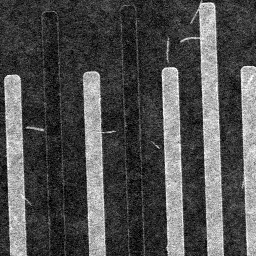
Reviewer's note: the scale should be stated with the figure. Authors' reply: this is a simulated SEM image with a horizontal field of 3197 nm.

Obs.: parallel lines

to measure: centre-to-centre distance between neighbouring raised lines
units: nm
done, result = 493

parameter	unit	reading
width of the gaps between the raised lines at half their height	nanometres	303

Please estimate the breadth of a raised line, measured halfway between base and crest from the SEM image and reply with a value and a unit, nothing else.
190 nm